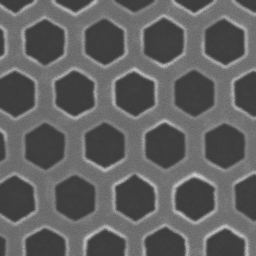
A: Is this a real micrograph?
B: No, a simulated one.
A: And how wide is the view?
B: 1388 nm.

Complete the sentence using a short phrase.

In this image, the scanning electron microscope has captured a regular array of holes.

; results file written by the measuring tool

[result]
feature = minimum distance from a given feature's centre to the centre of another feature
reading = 323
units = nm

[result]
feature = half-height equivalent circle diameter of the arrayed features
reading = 232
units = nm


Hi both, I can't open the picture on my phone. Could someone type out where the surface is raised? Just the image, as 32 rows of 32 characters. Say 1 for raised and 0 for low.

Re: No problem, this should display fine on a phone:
00001110000111100001110000111100
11111111111111111111111111111111
11111011111111111111011111111111
11110000111000011100000111000011
01100000110000001100000110000001
01100000110000001100000110000001
01100000111000001100000111000001
11110001111100111110001111100111
11111111111111111111111111111111
00011111000111110011111000111100
00001110000011000001110000011000
00001110000011000001110000011000
00001110000011000001110000011000
00001110000111100001110000111100
10111111101111111111111101111111
11111011111110111111011111111111
11110000111000011100000111000011
01100000111000001100000111000001
01100000111000001100000111000001
01100000111000001100000111000001
11110001111100111110001111100111
11111111111111111111111111111111
10011111000111110011111101111100
00001110000011000001110000011000
00001110000011000001110000011000
00001110000011000001110000011000
00001110000011100001111000111100
10111111101111110111111101111110
11111111111111111111011111111111
11110000111100011100000111000011
01100000111000001100000111000001
01100000111000001100000111000001